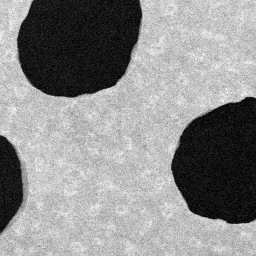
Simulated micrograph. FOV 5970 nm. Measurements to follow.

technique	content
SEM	holes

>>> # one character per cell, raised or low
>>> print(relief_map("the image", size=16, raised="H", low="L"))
HHLLLLLLLHHHHHHH
HLLLLLLLLHHHHHHH
HLLLLLLLLHHHHHHH
HLLLLLLLHHHHHHHH
HLLLLLLLHHHHHHHH
HHLLLLLHHHHHHHHH
HHHHHHHHHHHHHHLL
HHHHHHHHHHHHLLLL
HHHHHHHHHHHLLLLL
LHHHHHHHHHHLLLLL
LLHHHHHHHHHLLLLL
LLHHHHHHHHHLLLLL
LLHHHHHHHHHHLLLL
LHHHHHHHHHHHHLLL
HHHHHHHHHHHHHHHH
HHHHHHHHHHHHHHHH